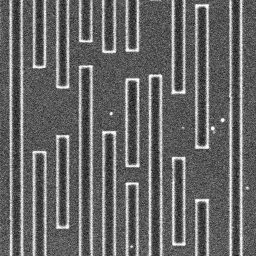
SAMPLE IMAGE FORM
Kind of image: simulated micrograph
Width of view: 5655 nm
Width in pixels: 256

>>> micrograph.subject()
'wiring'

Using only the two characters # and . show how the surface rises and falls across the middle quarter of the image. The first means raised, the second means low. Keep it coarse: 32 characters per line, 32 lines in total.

#..........................###..
#...###....................###..
#...###....................###..
#...###..............###...###..
#...###.........##...###...###..
#...###.........##...###...###..
....###.........##...###...###..
....###.........##...###........
....###.........##...###........
....###.........##...###........
....###.........###..###........
....###.........###..###........
....###.........###..###........
....###.........###..###........
....###.........###..###........
....###.........###..###........
....###.........###..###........
....###...###...###..###........
#...###...###...###..###........
#...###...###...###..###........
#...###...###...###..###........
#...###...###...###..###........
#...###...###...###..###........
#...###...###...###..###...###..
#...###...###...###..###...###..
#...###...###...###..###...###..
#...###...###........###...###..
#...###...###........###...###..
#...###...###........###...###..
#...###...###........###...###..
#...###...###...##...###...###..
#...###...###...##...###...###..